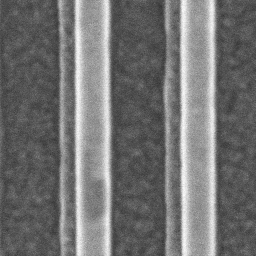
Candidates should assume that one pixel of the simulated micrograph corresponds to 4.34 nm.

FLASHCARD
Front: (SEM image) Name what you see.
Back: lines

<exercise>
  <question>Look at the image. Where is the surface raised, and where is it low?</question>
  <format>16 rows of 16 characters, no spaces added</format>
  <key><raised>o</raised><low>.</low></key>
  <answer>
....ooo...ooo...
....ooo...ooo...
....ooo...ooo...
....ooo...ooo...
....ooo...ooo...
....ooo...ooo...
....ooo...ooo...
....ooo...ooo...
....ooo...ooo...
....ooo...ooo...
....ooo...ooo...
....ooo...ooo...
....ooo...ooo...
....ooo...ooo...
....ooo...ooo...
....ooo...ooo...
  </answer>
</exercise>